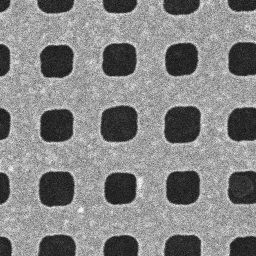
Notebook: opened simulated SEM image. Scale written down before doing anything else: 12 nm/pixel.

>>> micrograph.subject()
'a regular array of holes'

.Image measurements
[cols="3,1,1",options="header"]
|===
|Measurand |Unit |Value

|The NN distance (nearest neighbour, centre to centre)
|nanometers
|751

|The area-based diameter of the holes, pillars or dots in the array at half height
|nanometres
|438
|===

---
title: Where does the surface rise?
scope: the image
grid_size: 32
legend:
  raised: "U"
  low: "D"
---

DUUUUDDDDUUUUDDDDUUUDDDDDUUUUDDD
UUUUUUDDUUUUUDDDUUUUUDDDUUUUUUUU
UUUUUUUUUUUUUUUUUUUUUUUUUUUUUUUU
UUUUUUUUUUUUUUUUUUUUUUUUUUUUUUUU
UUUUUUUUUUUUUUUUUUUUUUUUUUUUUUUU
UUUUUUUUUUUUUUDDUUUUUUDDUUUUUDDD
DUUUUDDDDUUUUDDDDUUUUDDDDUUUUDDD
DUUUUDDDDUUUUDDDDUUUUDDDDUUUUDDD
DUUUUDDDDUUUUDDDDUUUUDDDDUUUUDDD
UUUUUUDDUUUUUUDDUUUUUUDUUUUUUUDU
UUUUUUUUUUUUUUUUUUUUUUUUUUUUUUUU
UUUUUUUUUUUUUUUUUUUUUUUUUUUUUUUU
UUUUUUUUUUUUUUUUUUUUUUUUUUUUUUUU
UUUUUUUUUUUUUUDDDUUUUUDDDUUUUUDD
DUUUUDDDDUUUUDDDDUUUUDDDDUUUUDDD
DUUUUDDDDUUUUDDDDUUUDDDDDUUUDDDD
DUUUUDDDDUUUUDDDDUUUDDDDDUUUDDDD
UUUUUDDDUUUUUDDDUUUUUDDDUUUUUDDD
UUUUUUUUUUUUUUUUUUUUUUUUUUUUUUUU
UUUUUUUUUUUUUUUUUUUUUUUUUUUUUUUU
UUUUUUUUUUUUUUUUUUUUUUUUUUUUUUUU
UUUUUUDDUUUUUUUUUUUUUUDDUUUUUDDD
DUUUUDDDDUUUUDDDDUUUUDDDDUUUUDDD
DUUUUDDDDUUUUDDDDUUUUDDDDUUUDDDD
DUUUUDDDDUUUUDDDDUUUUDDDDUUUUDDD
UUUUUDDDDUUUUUDDUUUUUUDDUUUUUDDD
UUUUUUUUUUUUUUUUUUUUUUUUUUUUUUUU
UUUUUUUUUUUUUUUUUUUUUUUUUUUUUUUU
UUUUUUUUUUUUUUUUUUUUUUUUUUUUUUUU
UUUUUUDDDUUUUUDDUUUUUDDDDUUUUUUD
DUUUUDDDDDUUUDDDDUUUUDDDDUUUUDDD
DDUUUDDDDDUUUDDDDUUUDDDDDUUUUDDD